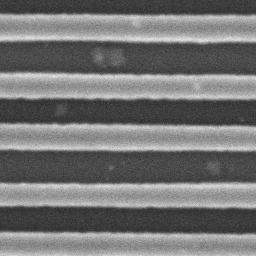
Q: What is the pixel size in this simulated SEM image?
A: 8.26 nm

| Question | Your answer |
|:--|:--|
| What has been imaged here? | lines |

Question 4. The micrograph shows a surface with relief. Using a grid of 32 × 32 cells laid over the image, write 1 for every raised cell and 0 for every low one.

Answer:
00000000000000000000000000000000
00000000000000000000000000000000
11111111111111111111111111111111
11111111111111111111111111111111
11111111111111111111111111111111
00000000000000000000000000000000
00000000000000000000000000000000
00000000000000000000000000000000
00000000000000000000000000000000
10111101010000000000000000000000
11111111111111111111111111111111
11111111111111111111111111111111
00000000000000000000000000000000
00000000000000000000000000000000
00000000000000000000000000000000
00000000000000000000000000000000
11111111111111111111111111111111
11111111111111111111111111111111
00111111111111111111111111111111
00000000000000000000000000000000
00000000000000000000000000000000
00000000000000000000000000000000
00000000000000000000000000000000
11111111111111111111111111111111
11111111111111111111111111111111
11111111111111111111111111111111
00000000000000000000000000000000
00000000000000000000000000000000
00000000000000000000000000000000
11111111111111111111111111111111
11111111111111111111111111111111
11111111111111111111111111111111